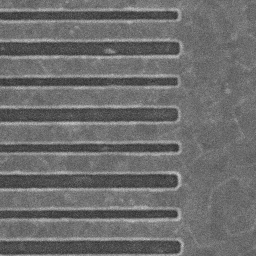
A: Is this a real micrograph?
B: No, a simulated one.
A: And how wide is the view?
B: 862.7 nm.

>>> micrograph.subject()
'parallel lines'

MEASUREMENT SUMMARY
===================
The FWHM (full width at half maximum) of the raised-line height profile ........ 66.6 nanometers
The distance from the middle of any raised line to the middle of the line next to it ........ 112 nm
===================